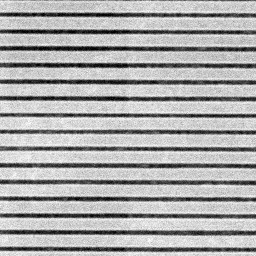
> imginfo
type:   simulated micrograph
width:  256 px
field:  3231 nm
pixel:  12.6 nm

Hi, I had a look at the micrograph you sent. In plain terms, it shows parallel lines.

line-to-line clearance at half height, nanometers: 78.9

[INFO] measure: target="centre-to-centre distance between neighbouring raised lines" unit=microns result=0.211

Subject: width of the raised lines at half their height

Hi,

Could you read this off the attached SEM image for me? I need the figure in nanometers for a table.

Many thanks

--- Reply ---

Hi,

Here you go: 130